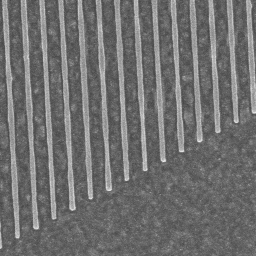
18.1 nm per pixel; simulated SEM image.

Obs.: parallel lines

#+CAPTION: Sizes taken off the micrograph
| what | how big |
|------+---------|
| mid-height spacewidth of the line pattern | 0.262 micrometres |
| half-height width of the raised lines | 4.49 px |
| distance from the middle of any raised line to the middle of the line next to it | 18.7 pixels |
